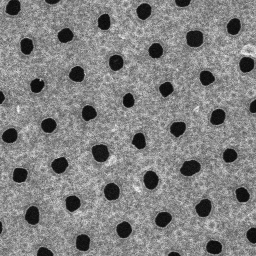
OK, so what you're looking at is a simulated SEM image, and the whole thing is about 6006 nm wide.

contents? a regular array of holes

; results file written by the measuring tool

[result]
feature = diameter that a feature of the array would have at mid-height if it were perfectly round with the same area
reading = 370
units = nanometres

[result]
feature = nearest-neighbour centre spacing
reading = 948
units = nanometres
